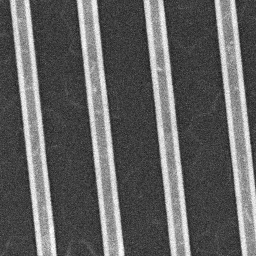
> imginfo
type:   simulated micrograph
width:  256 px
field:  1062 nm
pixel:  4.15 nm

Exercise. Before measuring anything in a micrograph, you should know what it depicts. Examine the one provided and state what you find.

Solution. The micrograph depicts one or a few lines or trenches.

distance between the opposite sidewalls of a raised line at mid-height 56.2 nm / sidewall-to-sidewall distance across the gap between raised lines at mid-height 221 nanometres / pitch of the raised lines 281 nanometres